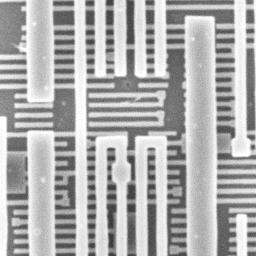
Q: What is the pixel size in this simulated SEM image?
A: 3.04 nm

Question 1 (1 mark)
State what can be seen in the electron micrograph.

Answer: wiring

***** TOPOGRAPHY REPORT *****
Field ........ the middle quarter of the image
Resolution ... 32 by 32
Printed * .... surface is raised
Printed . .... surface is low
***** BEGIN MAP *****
...***..**...**...**...**......*
...***..**...**...**...**......*
...***..**...**...**...**......*
...***.........................*
...**..........................*
...**..........................*
...**..........................*
...**..........................*
...**..........................*
...**..........................*
...**..........................*
...**..........................*
...**..........................*
...**..........................*
...***.........................*
...***.........................*
...***.........................*
...***.........................*
...***..********..********.....*
...***..********..********.....*
...***..********..********.....*
...***..**...***..**...***.....*
...***..***..***..***..***.....*
...***..***..***..***..***.....*
...***..***..***..***..***.....*
...***..***.*****.***..***.....*
...***..***.*****.***..***.....*
...***..***.*****.***..***.....*
...***..***.*****.***..***.....*
...***..***..***..***..***.....*
...***..***..***..***..***.....*
...***..**...**...***..***.....*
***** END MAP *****